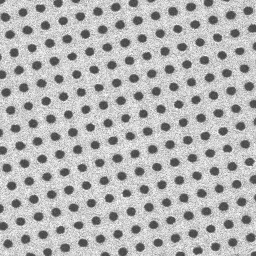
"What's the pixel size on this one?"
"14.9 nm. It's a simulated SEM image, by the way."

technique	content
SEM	a regular array of holes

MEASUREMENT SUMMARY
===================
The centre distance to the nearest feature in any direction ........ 0.268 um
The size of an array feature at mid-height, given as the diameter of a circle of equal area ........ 0.133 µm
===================